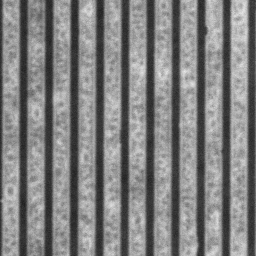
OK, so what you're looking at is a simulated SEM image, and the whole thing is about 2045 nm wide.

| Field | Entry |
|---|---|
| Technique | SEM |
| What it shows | parallel lines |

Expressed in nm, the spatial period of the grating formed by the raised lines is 203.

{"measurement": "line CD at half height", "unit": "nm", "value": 122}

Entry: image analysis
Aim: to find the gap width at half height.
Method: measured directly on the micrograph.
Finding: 0.0769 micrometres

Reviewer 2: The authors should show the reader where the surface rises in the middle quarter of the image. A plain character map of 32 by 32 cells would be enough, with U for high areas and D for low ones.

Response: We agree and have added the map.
UDDDUUUUDDUUUUDDDUUUDDDUUUUDDUUU
UDDDUUUUDDUUUUDDDUUUDDDUUUUDDUUU
UDDDUUUDDDUUUUDDDUUUDDDUUUUDDUUU
UDDDUUUDDDUUUUDDDUUUDDDUUUUDDUUU
UDDDUUUDDDUUUUDDDUUUDDDUUUUDDUUU
UDDDUUUDDDUUUUDDDUUUDDDUUUUDDUUU
UDDDUUUDDDUUUUDDDUUUDDDUUUUDDUUU
UDDDUUUDDDUUUUDDDUUUDDDUUUUDDUUU
UDDDUUUDDDUUUUDDDUUUDDDUUUUDDUUU
UDDDUUUDDDUUUUDDDUUUDDDUUUUDDUUU
UDDDUUUDDDUUUUDDDUUUDDDUUUUDDUUU
UDDDUUUDDDUUUUDDDUUUDDDUUUUDDUUU
UDDDUUUDDDUUUUDDDUUUDDDUUUUDDUUU
UDDDUUUDDDUUUUDDDUUUDDDUUUUDDUUU
UDDDUUUDDDUUUUDDDUUUDDDUUUUDDUUU
UDDDUUUDDDUUUUDDDUUUDDDUUUUDDUUU
UDDDUUUDDDUUUUDDDUUUDDDUUUUDDUUU
UDDDUUUDDDUUUUDDDUUUDDDUUUUDDUUU
UDDDUUUDDDUUUUDDDUUUDDDUUUUDDUUU
UDDDUUUDDDUUUUDDDUUUDDDUUUUDDUUU
UDDDUUUDDDUUUUDDDUUUDDDUUUUDDUUU
UDDDUUUDDDUUUUDDDUUUDDDUUUUDDUUU
UDDDUUUDDDUUUUDDDUUUDDDUUUUDDUUU
UDDDUUUDDDUUUUDDDUUUDDDUUUUDDUUU
UDDDUUUDDDUUUUDDDUUUDDDUUUUDDUUU
UDDDUUUDDDUUUUDDDUUUDDDUUUUDDUUU
UDDDUUUDDDUUUUDDDUUUDDDUUUUDDUUU
UDDDUUUDDDUUUUDDUUUUDDDUUUUDDUUU
UDDDUUUDDDUUUUDDUUUUDDDUUUUDDUUU
UDDDUUUDDDUUUUDDUUUUDDDUUUUDDUUU
UDDDUUUDDDUUUUDDUUUUDDDUUUUDDUUU
UDDDUUUDDDUUUUDDUUUUDDDUUUUDDUUU